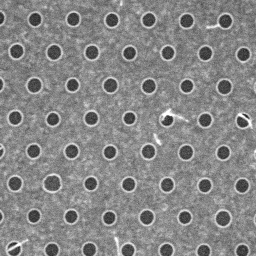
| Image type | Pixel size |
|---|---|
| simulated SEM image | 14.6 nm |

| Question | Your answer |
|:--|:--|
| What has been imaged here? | a regular array of holes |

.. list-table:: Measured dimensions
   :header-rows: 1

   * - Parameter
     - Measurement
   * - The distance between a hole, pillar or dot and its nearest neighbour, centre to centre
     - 546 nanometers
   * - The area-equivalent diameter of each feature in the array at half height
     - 0.202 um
